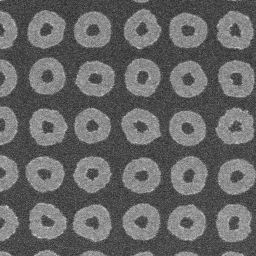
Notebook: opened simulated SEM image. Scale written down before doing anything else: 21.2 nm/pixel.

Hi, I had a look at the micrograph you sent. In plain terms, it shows a regular array of ring-shaped raised bodies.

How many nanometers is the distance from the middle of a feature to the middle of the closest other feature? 990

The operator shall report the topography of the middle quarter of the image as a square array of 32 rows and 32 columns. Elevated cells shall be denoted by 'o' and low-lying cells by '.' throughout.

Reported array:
.....oooooo.....ooooooo.....oooo
....oooooooo....ooo.oooo....oooo
....ooo..ooo...ooo...ooo...ooo..
...ooo....oo....oo...ooo...oo...
...ooo....oo....oo...ooo...ooo..
....oooooooo....ooooooo....ooo.o
....ooooooo.....oooooo......oooo
......oooo........oooo.......ooo
................................
................................
................................
......oo.........oo.............
....oooooo......oooooo......oooo
...oooooooo....oooooooo....ooooo
...ooo..ooo....ooo..ooo....ooo.o
o..oo....ooo...oo....ooo...oo...
...ooo..ooo....ooo...ooo...oo...
...oooooooo.....oooooooo...ooo..
....oooooo......ooooooo....ooooo
.....ooo.........oooo.......oooo
................................
................................
................................
......ooo......................o
....oooooo.......ooooo.......ooo
...oooooooo.....ooooooo.....oooo
...ooo...oo....oooo..ooo...ooo..
...oo....ooo...ooo...ooo...ooo..
...ooo..ooo....oo....ooo...ooo..
...oooooooo....oooo.oooo...ooo..
....oooooo......ooooooo....ooooo
.....ooo.........ooooo......oooo